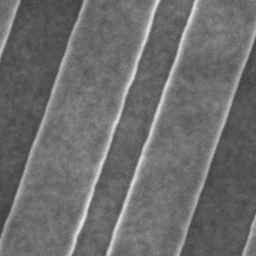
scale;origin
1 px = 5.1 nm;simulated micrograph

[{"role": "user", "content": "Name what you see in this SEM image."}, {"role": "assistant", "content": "lines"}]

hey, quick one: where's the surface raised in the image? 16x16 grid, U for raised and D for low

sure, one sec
UDDDDUUUUUUUUUUU
UDDDDUUUUUUUUUUU
DDDDUUUUUUUUUUUU
DDDDUUUUUUUUUUUU
DDDDUUUUUUUUUUUD
DDDUUUUUUUUUUUUD
DDDUUUUUUUUUUUDD
DDDUUUUUUUUUUUDD
DDUUUUUUUUUUUUDD
DDUUUUUUUUUUUDDD
DDUUUUUUUUUUUDDD
DUUUUUUUUUUUUDDD
DUUUUUUUUUUUDDDD
DUUUUUUUUUUUDDDD
UUUUUUUUUUUUDDDD
UUUUUUUUUUUDDDDU